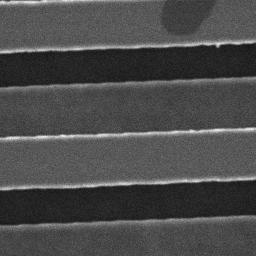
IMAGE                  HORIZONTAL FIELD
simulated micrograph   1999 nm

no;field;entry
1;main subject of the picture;lines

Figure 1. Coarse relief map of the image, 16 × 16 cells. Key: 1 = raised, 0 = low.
1111111111111111
1111111111111111
1111111111111111
0000000000000000
0000000000000000
1111111111111111
1111111111111111
1111111111111111
1111111111111111
1111111111111111
1111111111111111
1111111110000000
0000000000000000
0000000000000000
1111111111111111
1111111111111111